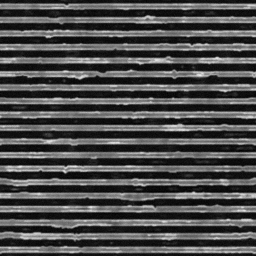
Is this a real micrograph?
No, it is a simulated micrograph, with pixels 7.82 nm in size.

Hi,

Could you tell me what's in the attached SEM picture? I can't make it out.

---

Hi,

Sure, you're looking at parallel lines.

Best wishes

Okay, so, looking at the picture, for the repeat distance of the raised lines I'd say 106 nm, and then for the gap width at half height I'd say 63.5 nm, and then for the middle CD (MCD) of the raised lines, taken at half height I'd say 42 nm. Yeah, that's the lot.